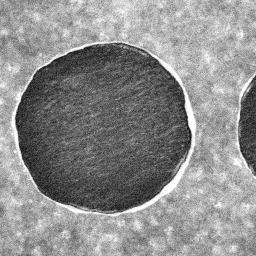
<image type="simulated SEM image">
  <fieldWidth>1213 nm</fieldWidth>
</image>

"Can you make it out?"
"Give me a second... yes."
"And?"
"holes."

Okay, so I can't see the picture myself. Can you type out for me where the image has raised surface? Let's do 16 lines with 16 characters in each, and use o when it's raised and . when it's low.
oooooooooooooooo
oooooooooooooooo
oooooooooooooooo
oooo......oooooo
oo.........ooooo
oo.........oooo.
o...........ooo.
o...........ooo.
o...........ooo.
o...........ooo.
oo.........ooooo
oo.........ooooo
ooo......ooooooo
oooooooooooooooo
oooooooooooooooo
oooooooooooooooo